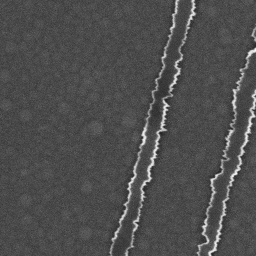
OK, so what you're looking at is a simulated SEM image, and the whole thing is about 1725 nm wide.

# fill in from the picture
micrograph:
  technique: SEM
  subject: one or a few lines or trenches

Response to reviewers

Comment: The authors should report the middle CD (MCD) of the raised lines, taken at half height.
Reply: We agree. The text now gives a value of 112 nm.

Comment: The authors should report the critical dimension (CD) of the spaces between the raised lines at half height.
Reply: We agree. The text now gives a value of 0.436 microns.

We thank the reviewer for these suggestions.